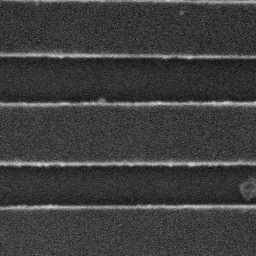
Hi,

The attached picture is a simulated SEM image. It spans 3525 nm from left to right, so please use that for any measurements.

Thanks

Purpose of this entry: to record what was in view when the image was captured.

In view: lines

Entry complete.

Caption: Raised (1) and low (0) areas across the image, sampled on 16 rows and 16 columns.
1111111111111111
1111111111111111
1111111111111111
0001111111111111
0000000000000000
0000000000000000
0000111101111111
1111111111111111
1111111111111111
1111111111111111
0000000000000000
0000000000000000
0000000000000000
1111111111111111
1111111111111111
1111111111111111